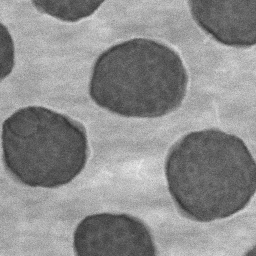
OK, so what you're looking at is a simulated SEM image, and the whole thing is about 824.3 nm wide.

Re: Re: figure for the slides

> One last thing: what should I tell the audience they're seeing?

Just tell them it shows holes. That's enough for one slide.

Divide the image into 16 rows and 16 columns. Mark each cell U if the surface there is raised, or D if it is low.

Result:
UUDDDDUUUUUUDDDD
UUUUUUUUUUUUDDDD
DUUUUUUUDUUUUUDD
DUUUUUDDDDDUUUUU
DUUUUUDDDDDDUUUU
UUUUUUDDDDDDUUUU
UUUUUUDDDDDUUUUU
DDDDUUUUUUUUUUUU
DDDDDUUUUUUUDDDU
DDDDDUUUUUUDDDDD
DDDDDUUUUUDDDDDD
UUDDUUUUUUUDDDDD
UUUUUUUUUUUDDDDD
UUUUUUDDUUUUDDUU
UUUUUDDDDUUUUUUU
UUUUUDDDDDUUUUUU